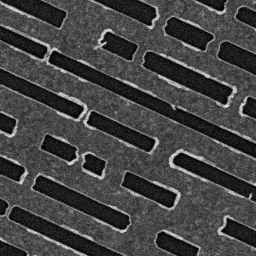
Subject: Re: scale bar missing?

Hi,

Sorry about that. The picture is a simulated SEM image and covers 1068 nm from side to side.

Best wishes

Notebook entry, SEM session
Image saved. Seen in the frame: parallel lines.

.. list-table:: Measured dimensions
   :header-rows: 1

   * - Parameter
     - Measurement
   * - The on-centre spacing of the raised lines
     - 163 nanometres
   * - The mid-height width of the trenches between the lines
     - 64.4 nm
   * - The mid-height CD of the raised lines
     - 98.4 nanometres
